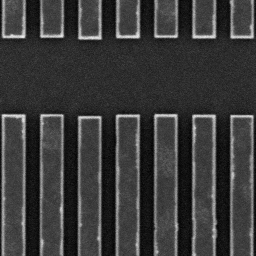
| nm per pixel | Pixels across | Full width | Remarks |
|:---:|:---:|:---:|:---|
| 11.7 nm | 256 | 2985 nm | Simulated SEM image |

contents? parallel lines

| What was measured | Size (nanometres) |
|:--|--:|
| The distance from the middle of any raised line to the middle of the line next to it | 443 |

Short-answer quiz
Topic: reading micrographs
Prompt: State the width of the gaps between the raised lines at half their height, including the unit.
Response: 195 nanometres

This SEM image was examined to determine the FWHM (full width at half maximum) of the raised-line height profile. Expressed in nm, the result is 251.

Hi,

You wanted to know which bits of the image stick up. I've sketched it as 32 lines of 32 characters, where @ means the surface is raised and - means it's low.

-@@--@@@--@@@--@@---@@--@@@--@@@
@@@--@@@--@@@--@@---@@--@@@--@@@
@@@--@@@--@@@--@@---@@--@@@--@@@
@@@--@@@--@@@--@@---@@--@@@--@@@
-@@--@@---@@---@@---@@--@@@--@@-
--------------------------------
--------------------------------
--------------------------------
--------------------------------
--------------------------------
--------------------------------
--------------------------------
--------------------------------
--------------------------------
--------------------@@----------
@@@--@@@--@@---@@---@@--@@@--@@@
@@@--@@@--@@---@@---@@--@@@--@@@
@@@--@@@--@@---@@---@@--@@@--@@@
@@@--@@@--@@---@@---@@--@@@--@@@
@@@--@@@--@@---@@---@@--@@@--@@@
@@@--@@@--@@---@@---@@--@@@--@@@
@@@--@@@--@@---@@--@@@--@@@--@@@
@@@--@@@--@@---@@--@@@--@@@--@@@
@@@--@@@--@@---@@--@@@--@@@--@@@
@@@--@@@--@@---@@--@@@--@@@--@@@
@@@--@@@--@@---@@--@@@--@@@--@@@
@@@--@@@--@@---@@--@@@--@@@--@@@
@@@--@@@--@@---@@--@@@--@@@--@@@
@@@--@@@--@@---@@--@@@--@@@--@@@
@@@--@@@--@@---@@--@@@--@@@--@@@
@@@--@@@--@@---@@--@@@--@@@--@@@
@@@--@@@--@@---@@--@@@--@@@--@@@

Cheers